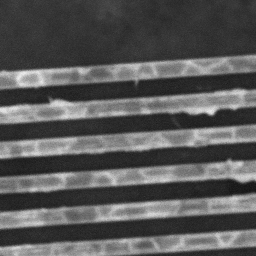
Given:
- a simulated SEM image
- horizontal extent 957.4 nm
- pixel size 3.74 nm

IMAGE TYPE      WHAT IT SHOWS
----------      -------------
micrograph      parallel lines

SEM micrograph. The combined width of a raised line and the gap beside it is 130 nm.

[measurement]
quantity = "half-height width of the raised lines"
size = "58.7 nm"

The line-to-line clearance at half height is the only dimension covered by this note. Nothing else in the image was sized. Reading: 72.3 nanometres